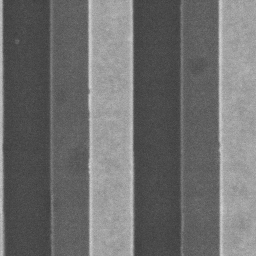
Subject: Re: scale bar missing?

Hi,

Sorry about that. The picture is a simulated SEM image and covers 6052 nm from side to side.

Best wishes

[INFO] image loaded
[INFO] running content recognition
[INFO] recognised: lines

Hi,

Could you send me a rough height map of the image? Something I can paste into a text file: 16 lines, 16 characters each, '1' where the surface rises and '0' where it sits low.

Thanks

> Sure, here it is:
0001111100011111
0001111100011111
0001111100011111
0001111100011111
0001111100011111
0001111100011111
0001111100011111
0001111100011111
0001111100011111
0001111100011111
0001111100011111
0001111100011111
0001111100011111
0001111100011111
0001111100011111
0001111100011111